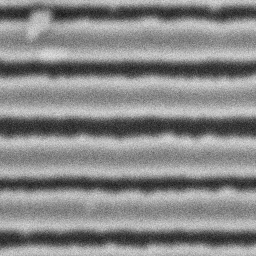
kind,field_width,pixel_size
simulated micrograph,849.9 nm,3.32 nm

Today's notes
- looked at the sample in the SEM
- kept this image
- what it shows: lines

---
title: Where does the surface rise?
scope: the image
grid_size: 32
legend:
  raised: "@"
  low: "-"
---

@@@@--@@-@-----@@---@------@----
----@@--------------------------
----@@----@------@@@---@-------@
@@@@@@@@@@@@@@@@@@@@@@@@@@@@@@@@
@@@@@@@@@@@@@@@@@@@@@@@@@@@@@@@@
@@@@@@@@@@@@@@@@@@@@@@@@@@@@@@@@
@@@@@@@@@@@@@@@@@@@@@@@@@@@@@@@@
------@-----------------@-------
--------------------------------
-----@--------------------------
@@@@@@@@@@@@@@@@@@@@@@@@@@@@@@@@
@@@@@@@@@@@@@@@@@@@@@@@@@@@@@@@@
@@@@@@@@@@@@@@@@@@@@@@@@@@@@@@@@
@@@@@@@@@@@@@@@@@@@@@@@@@@@@@@@@
-------@----@@----------@-------
--------------------------------
--------------------------------
@@@@@@@@@@@@@@@@@@@@@@@@@@@@@@@@
@@@@@@@@@@@@@@@@@@@@@@@@@@@@@@@@
@@@@@@@@@@@@@@@@@@@@@@@@@@@@@@@@
@@@@@@@@@@@@@@@@@@@@@@@@@@@@@@@@
@@@@@@@@@@@@@@@@@@@@@@@@@@@@@@@@
--------------------------------
--------------------------------
@@@@@@@@@@@@@@@@@@@@@@@@@@@@@@@@
@@@@@@@@@@@@@@@@@@@@@@@@@@@@@@@@
@@@@@@@@@@@@@@@@@@@@@@@@@@@@@@@@
@@@@@@@@@@@@@@@@@@@@@@@@@@@@@@@@
@@@@@@@@@@@@@@@-@@@@@@@@@@@@@@@@
--------------------------------
--------------------------------
@@@@@@@@@@@@@@@@@@@@@@@@@@@@@@@@